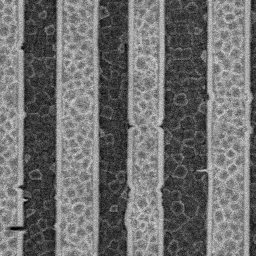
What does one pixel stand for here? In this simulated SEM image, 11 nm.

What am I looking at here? one or a few lines or trenches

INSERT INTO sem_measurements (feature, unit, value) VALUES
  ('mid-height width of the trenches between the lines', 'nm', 428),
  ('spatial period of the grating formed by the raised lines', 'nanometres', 832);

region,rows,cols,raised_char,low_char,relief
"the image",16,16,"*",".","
*...**..**...**.
*...**..**...**.
*...**..**...**.
*...**..**...**.
*...**..**...**.
*...**..**...**.
*...**..**...***
*...**..**...***
*...**..**...**.
*...**..**...**.
*...**..**...**.
*...**..**...**.
*...**..**...**.
*...**..**...**.
*...**..**...**.
*...**..**...**.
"